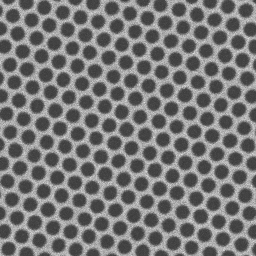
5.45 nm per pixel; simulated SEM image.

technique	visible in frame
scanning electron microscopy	a regular array of holes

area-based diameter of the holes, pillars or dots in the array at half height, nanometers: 80.5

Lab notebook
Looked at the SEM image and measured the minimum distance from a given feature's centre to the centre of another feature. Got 98.5 nanometers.